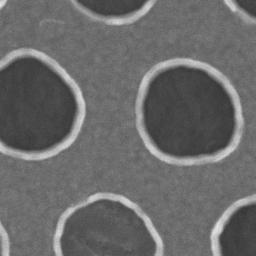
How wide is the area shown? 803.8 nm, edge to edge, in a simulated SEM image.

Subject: holes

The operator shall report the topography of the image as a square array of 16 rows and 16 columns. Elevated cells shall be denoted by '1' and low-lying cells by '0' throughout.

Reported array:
1111100001111110
1111111111111111
1111111111111111
1011111111111111
0000111111000111
0000111110000011
0000011110000001
0000011110000001
0000111110000001
1001111111000011
1111111111111111
1111111111111111
1111110111111111
1111000001111100
1111000001111100
1111000000111100